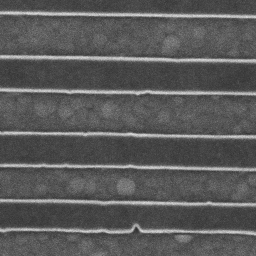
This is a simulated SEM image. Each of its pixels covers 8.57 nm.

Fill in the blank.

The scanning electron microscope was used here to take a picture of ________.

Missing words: one or a few lines or trenches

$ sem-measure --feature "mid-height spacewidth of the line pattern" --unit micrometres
0.361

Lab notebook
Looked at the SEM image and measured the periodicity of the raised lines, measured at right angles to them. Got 605 nm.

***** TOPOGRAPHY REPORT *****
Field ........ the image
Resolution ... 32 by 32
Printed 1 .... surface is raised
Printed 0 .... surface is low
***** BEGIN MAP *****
11111111111111111111111111111111
11111111111111111111111111111111
00000000000000000000000000000000
00000000000000000000000000000000
00000000000000000000000000000000
00000000000000000000000000000000
00000000000000000000000000000000
11111111111111111111110001100000
11111111111111111111111111111111
11111111111111111111111111111111
11111111111111111111111111111111
00000000110000111111111111111111
00000000000000000000000000000000
00000000000000000000000000000000
00000000000000000000000000000000
00000000000000000000000000000000
00000000000000000000000000000000
11111111111111111111111111111111
11111111111111111111111111111111
11111111111111111111111111111111
11111111111111111111111111111111
00000000000000000000000000000000
00000000000000000000000000000000
00000000000000000000000000000000
00000000000000000000000000000000
11111111111111111111100001111000
11111111111111111111111111111111
11111111111111111111111111111111
11111111111111111111111111111111
00000000000000000000000000000000
00000000000000000000000000000000
00000000000000000000000000000000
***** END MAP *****